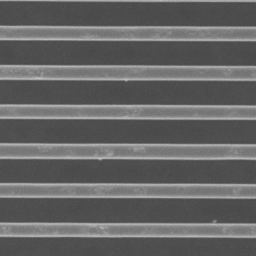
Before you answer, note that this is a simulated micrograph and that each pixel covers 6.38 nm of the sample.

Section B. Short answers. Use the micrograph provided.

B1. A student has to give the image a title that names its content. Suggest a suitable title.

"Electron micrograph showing parallel lines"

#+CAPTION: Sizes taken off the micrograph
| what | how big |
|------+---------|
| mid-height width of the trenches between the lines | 161 nm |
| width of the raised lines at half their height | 86.9 nm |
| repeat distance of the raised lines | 251 nm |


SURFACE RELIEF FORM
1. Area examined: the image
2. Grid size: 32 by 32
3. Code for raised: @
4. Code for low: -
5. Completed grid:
--------------------------------
--------------------------------
--------------------------------
@@@@@@@@@@@@@@@@@@@@@@@@@@@@@@@@
@@@@@@@@@@@@@@@@@@@@@@@@@@@@@@@@
--------------------------------
--------------------------------
--------------------------------
@@@@@@@@@@@@@@@@@@@@@@@@@@@@@@@@
@@@@@@@@@@@@@@@@@@@@@@@@@@@@@@@@
--------------------------------
--------------------------------
--------------------------------
@@@@@@@@@@@@@@@@@@@@@@@@@@@@@@@@
@@@@@@@@@@@@@@@@@@@@@@@@@@@@@@@@
--------------------------------
--------------------------------
--------------------------------
@@@@@@@@@@@@@@@@@@@@@@@@@@@@@@@@
@@@@@@@@@@@@@@@@@@@@@@@@@@@@@@@@
--------------------------------
--------------------------------
--------------------------------
@@@@@@@@@@@@@@@@@@@@@@@@@@@@@@@@
@@@@@@@@@@@@@@@@@@@@@@@@@@@@@@@@
--------------------------------
--------------------------------
--------------------------------
@@@@@@@@@@@@@@@@@@@@@@@@@@@@@@@@
@@@@@@@@@@@@@@@@@@@@@@@@@@@@@@@@
--------------------------------
--------------------------------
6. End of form